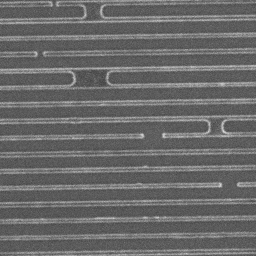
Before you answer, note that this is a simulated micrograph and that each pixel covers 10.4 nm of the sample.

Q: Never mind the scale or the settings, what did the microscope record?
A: parallel lines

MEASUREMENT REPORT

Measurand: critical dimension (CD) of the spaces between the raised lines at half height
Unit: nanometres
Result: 132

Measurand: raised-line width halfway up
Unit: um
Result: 0.0389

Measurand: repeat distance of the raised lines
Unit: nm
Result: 173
